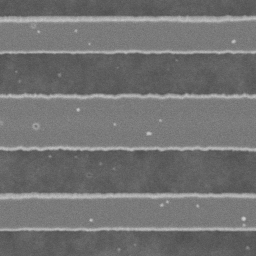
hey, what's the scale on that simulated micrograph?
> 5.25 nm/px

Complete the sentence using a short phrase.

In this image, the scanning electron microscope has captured lines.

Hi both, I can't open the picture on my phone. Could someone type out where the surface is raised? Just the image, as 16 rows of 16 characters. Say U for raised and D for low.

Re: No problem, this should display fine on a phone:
DDDDDDDDDDDDDDDD
UUUUUUUUUUUUUUUU
UUUUUUUUUUUUUUUU
DDDDDDDDDDDDDDDD
DDDDDDDDDDDDDDDD
DDDDDDDDDDDDDDDD
UUUUUUUUUUUUUUUU
UUUUUUUUUUUUUUUU
UUUUUUUUUUUUUUUU
DDDDDDDDDDDDDDDD
DDDDDDDDDDDDDDDD
DDDDDDDDDDDDDDDD
UUUUUUUUUUUUUUUU
UUUUUUUUUUUUUUUU
DDDDDDDDDDDDDDDD
DDDDDDDDDDDDDDDD